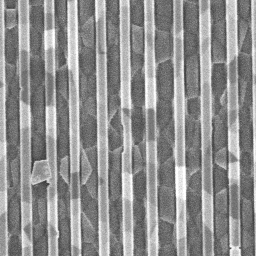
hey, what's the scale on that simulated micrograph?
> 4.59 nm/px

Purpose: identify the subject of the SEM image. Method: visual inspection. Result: parallel lines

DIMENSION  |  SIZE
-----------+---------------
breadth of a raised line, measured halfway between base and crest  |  39.6 nanometres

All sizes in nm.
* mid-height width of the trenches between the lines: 74.6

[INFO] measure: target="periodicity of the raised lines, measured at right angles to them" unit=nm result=119